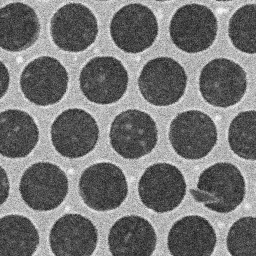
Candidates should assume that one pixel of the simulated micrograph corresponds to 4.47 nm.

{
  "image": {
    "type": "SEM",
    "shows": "a regular array of holes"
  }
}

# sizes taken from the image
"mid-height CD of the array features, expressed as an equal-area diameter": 0.222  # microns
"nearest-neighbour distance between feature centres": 59.2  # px